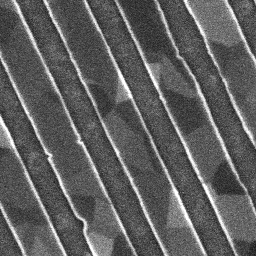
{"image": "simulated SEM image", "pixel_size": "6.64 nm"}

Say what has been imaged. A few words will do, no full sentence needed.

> one or a few lines or trenches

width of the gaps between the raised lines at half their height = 0.175 microns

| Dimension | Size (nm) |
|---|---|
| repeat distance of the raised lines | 424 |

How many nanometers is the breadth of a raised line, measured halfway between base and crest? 249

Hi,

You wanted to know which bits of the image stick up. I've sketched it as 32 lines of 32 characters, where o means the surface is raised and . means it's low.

oo....ooooo....ooooo...oooooo...
ooo...ooooo....ooooo....ooooo...
ooo....ooooo....ooooo...oooooo..
oooo...ooooo....ooooo....ooooo..
oooo....ooooo...ooooo....ooooo..
oooo....ooooo....ooooo....ooooo.
ooooo....ooooo...ooooo....ooooo.
ooooo....ooooo....ooooo....ooooo
.ooooo....ooooo...ooooo....ooooo
.ooooo....ooooo....ooooo....oooo
..ooooo...oooooo...oooooo...oooo
..ooooo....ooooo....ooooo...oooo
..oooooo...oooooo...oooooo...ooo
...ooooo....ooooo....ooooo...ooo
...oooooo...oooooo...ooooo....oo
o...ooooo....ooooo....ooooo...oo
o...oooooo...oooooo...ooooo....o
oo...ooooo....ooooo....ooooo...o
oo...oooooo...ooooo....ooooo....
oo....ooooo....ooooo....ooooo...
ooo...oooooo...ooooo....ooooo...
ooo....ooooo....ooooo....ooooo..
oooo...oooooo...ooooo....ooooo..
oooo....ooooo....ooooo....ooooo.
ooooo...ooooo....ooooo....ooooo.
ooooo....ooooo....ooooo...oooooo
oooooo...ooooo....ooooo....ooooo
.ooooo....ooooo....ooooo...ooooo
.oooooo....oooo....ooooo....oooo
..ooooo....ooooo...oooooo...oooo
..oooooo...ooooo....ooooo....ooo
...ooooo...oooooo...oooooo...ooo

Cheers